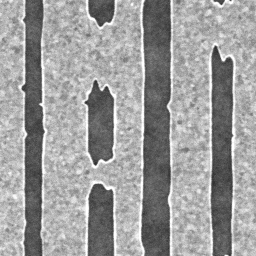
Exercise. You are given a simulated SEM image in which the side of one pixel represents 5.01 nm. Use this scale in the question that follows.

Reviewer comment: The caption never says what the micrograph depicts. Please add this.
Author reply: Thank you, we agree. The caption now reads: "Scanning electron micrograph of one or a few lines or trenches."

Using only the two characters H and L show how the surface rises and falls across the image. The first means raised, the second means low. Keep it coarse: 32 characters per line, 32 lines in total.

HHHLLLHHHHHLLLHHHHLLLHHHHHHLHHHH
HHHLLLHHHHHLLLHHHHLLLHHHHHHHHHHH
HHHLLHHHHHHHLLHHHHLLLHHHHHHHHHHH
HHHLLHHHHHHHHHHHHHLLLHHHHHHHHHHH
HHHLLHHHHHHHHHHHHHLLLHHHHHHHHHHH
HHHLLHHHHHHHHHHHHHLLLHHHHHHHHHHH
HHHLLHHHHHHHHHHHHHLLLHHHHHLHHHHH
HHHLLHHHHHHHHHHHHHLLLHHHHHLLLHHH
HHHLLHHHHHHHHHHHHHLLLHHHHHLLLHHH
HHHLLHHHHHHHHHHHHHLLLHHHHHLLLHHH
HHHLLHHHHHHHHHHHHHLLLHHHHHLLLHHH
HHHLLHHHHHHLLLHHHHLLLHHHHHLLLHHH
HHHLLHHHHHHLLLHHHHLLLHHHHHLLLHHH
HHHLLHHHHHHLLLHHHHLLLHHHHHLLLHHH
HHHLLLHHHHHLLLHHHHLLLHHHHHLLLHHH
HHHLLLHHHHHLLLHHHHLLLHHHHHLLLHHH
HHHLLLHHHHHLLLHHHHLLLHHHHHLLLHHH
HHHLLHHHHHHLLLHHHHLLLHHHHHLLLHHH
HHHLLHHHHHHLLLHHHHLLLHHHHHLLLHHH
HHHLLHHHHHHLLLHHHHLLLHHHHHLLLHHH
HHHLLHHHHHHHHHHHHHLLLHHHHHLLLHHH
HHHLLHHHHHHHHHHHHHLLLHHHHHLLLHHH
HHHLLHHHHHHHHHHHHHLLLHHHHHLLLHHH
HHHLLHHHHHHLLLHHHHLLLHHHHHLLLHHH
HHHLLHHHHHHLLLHHHHLLLHHHHHLLLHHH
HHHLLHHHHHHLLLHHHHLLLHHHHHLLLHHH
HHHLLHHHHHHLLLHHHHLLLHHHHHLLLHHH
HHHLLHHHHHHLLLHHHLLLLHHHHHLLLHHH
HHHLLHHHHHHLLLHHHLLLLHHHHHLLLHHH
HHHLLHHHHHHLLLHHHLLLLHHHHHLLLHHH
HHHLLHHHHHHLLLHHHHLLLHHHHHLLLHHH
HHHLLHHHHHHLLLHHHHLLLHHHHHLLLHHH